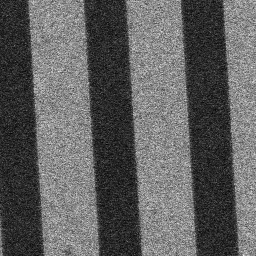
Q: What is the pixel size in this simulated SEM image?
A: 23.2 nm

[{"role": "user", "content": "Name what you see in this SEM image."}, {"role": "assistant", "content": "one or a few lines or trenches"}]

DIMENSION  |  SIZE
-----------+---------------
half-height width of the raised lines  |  43.7 px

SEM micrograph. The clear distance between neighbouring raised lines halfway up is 1.24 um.